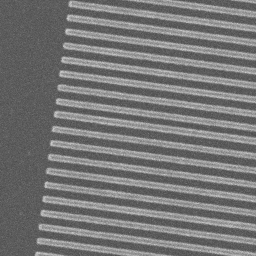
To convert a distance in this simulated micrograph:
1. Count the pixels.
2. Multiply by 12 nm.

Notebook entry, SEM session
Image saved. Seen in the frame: parallel lines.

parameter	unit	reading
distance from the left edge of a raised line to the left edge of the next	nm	169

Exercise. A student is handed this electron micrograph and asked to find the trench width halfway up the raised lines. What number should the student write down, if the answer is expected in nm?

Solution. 111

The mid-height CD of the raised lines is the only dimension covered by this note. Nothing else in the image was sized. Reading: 60.9 nm